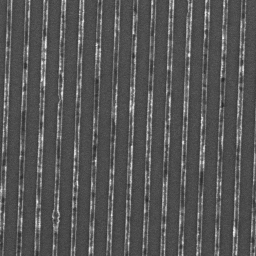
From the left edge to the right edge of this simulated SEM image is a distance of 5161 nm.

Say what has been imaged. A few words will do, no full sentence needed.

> parallel lines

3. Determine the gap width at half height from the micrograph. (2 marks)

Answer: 270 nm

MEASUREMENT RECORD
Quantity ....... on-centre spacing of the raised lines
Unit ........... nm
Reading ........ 363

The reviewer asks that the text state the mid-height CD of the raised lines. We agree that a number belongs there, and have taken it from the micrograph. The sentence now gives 93.2 nm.